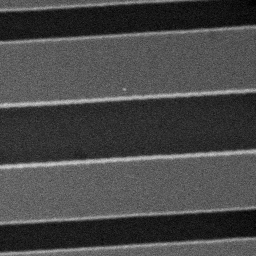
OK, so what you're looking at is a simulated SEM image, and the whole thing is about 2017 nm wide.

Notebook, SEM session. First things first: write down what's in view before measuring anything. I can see lines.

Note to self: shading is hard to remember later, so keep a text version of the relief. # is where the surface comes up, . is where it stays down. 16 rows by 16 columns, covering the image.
####............
................
...#############
################
################
################
###.............
................
................
...............#
################
################
################
########........
................
......##########